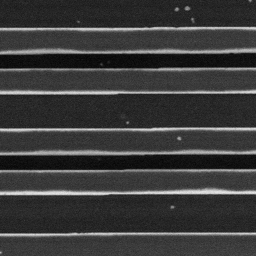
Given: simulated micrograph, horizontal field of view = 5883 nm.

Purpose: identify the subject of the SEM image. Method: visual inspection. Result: lines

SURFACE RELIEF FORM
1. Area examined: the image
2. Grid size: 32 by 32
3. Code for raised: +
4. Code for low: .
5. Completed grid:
................................
................................
................................
........................++++++++
++++++++++++++++++++++++++++++++
++++++++++++++++++++++++++++++++
+++++++++++++++++++++++++++++...
................................
................................
++++++++++++++++++++++++++++++++
++++++++++++++++++++++++++++++++
++++++++++++++++++++++++++++++++
................................
................................
................................
................................
++++++++++++++++++++++++++++++++
++++++++++++++++++++++++++++++++
++++++++++++++++++++++++++++++++
................................
................................
++++++++++++++++++++++++++++++++
++++++++++++++++++++++++++++++++
++++++++++++++++++++++++++++++++
................................
................................
................................
................................
................................
++++++++++++++++++++++++++++++++
++++++++++++++++++++++++++++++++
++++++++++++++++++++++++++++++++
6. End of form